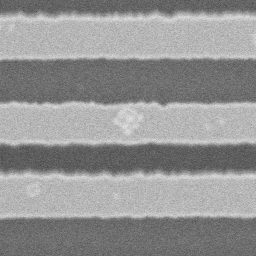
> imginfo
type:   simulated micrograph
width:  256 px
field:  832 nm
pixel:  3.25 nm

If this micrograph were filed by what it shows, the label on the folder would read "lines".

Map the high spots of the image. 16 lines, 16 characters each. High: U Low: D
DDDDDDDDDDDDDDDD
UUUUUUUUUUUUUUUU
UUUUUUUUUUUUUUUU
UUUUUUUUUUUUUUUU
DDDDDDDDDDDDDDDD
DDDDDDDDDDDDDDDD
UUDDUUDDUUDDDDUU
UUUUUUUUUUUUUUUU
UUUUUUUUUUUUUUUU
DDDDDDDDDDDDDDDD
DDDDDDDDDDDDDDDD
UUUUUUUUUUUUUUUU
UUUUUUUUUUUUUUUU
UUUUUUUUUUUUDDUU
DDDDDDDDDDDDDDDD
DDDDDDDDDDDDDDDD